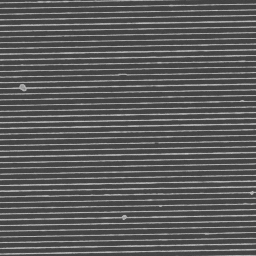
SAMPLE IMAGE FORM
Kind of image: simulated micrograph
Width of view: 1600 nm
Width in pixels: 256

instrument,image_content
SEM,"parallel lines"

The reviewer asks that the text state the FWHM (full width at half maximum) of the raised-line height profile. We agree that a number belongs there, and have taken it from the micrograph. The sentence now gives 6.3 nm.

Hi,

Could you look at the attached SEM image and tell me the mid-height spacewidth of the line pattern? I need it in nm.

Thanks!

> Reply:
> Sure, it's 28.9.